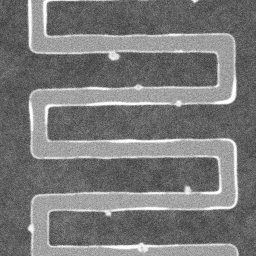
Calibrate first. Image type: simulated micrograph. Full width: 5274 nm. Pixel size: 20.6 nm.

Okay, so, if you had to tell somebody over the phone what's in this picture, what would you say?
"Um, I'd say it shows groups of lines, slits or small figures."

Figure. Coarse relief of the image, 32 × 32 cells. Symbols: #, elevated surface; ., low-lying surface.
....##..........................
....##..........................
....##..........................
....##..........................
....##..#####################...
....#########################...
....###########...##.....####...
...........................##...
...........................##...
...........................##...
...........................##...
....#########################...
....#########################...
....##..........................
....##..........................
....##..........................
....##..........................
....##................#######...
....#########################...
....#########################...
...........................##...
...........................##...
............................#...
...........................###..
.....#########################..
....#########################...
....##..........................
....##..........................
....##..........................
....##..........................
....##..........................
....##########################..